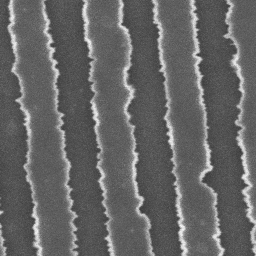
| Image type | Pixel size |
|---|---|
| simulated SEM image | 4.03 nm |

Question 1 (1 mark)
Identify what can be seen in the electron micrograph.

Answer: one or a few lines or trenches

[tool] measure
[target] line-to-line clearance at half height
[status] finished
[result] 0.135 micrometres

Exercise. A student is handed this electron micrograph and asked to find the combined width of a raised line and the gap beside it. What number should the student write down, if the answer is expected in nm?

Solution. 288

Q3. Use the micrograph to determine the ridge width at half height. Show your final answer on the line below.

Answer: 151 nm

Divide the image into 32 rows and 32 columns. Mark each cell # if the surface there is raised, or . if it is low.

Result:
.#####.....####....#####.....###
.#####....#####....#####.....###
.#####....#####....######...####
.#####.....#####....####.....###
.#####.....#####....#####...####
..####.....#####....#####....###
..#####....#####....#####.....##
..#####....#####....#####....###
..#####....#####....#####.....##
..#####....#####.....####.....##
..#####.....####.....####.....##
...####.....#####....####.....##
..#####....#####.....####.....##
...####.....####.....#####....##
...#####....####.....#####....##
...#####....####.....#####....##
...#####....#####....#####....##
....####....#####....#####....##
....####....#####....#####....##
...#####....#####.....####....##
...######...#####.....####....##
...######....####.....####.....#
....#####....####.....###.....##
....#####....####.....####.....#
....#####....#####....#####....#
....#####....#####....#####....#
....#####....#####....#####....#
....#####....######...#####....#
....#####....######...#####.....
....#####....######...#####....#
....#####.....#####....#####....
#....####.....#####....#####....